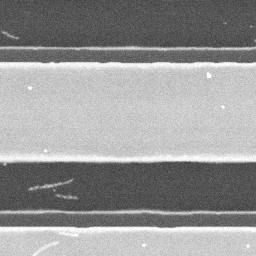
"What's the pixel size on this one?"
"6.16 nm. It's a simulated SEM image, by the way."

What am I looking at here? lines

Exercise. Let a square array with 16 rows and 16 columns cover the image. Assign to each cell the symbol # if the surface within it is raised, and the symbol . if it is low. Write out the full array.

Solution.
................
................
................
################
################
################
################
################
################
################
................
................
................
################
################
################